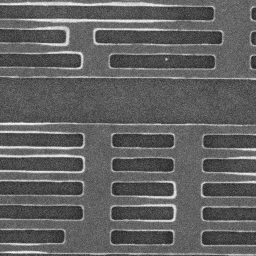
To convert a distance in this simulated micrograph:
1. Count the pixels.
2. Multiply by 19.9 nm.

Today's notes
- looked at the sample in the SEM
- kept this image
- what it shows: groups of lines, slits or small figures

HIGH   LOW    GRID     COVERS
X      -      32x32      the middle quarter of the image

----XXXXXXX---------------------
XXXXXXXXXXXXXXXXXXXXXXXXXXXXXXXX
XXXXXXXXXXXXXXXXXXXXXXXXXXXXXXXX
--------------------------------
--------------------------------
--------------------------------
--------------------------------
--------------------------------
--------------------------------
--------------------------------
--------------------------------
--------------------------------
--------------------------------
--------------------------------
--------------------------------
XXXXXXXXXXXXXXXXXXXXXXXXXXXXXXXX
XXXXXXXXXXXXXXXXXXXXXXXXXXXXXXXX
----XXXXXXXXX--------------XXXXX
-----XXXXXXX----------------XXXX
-----XXXXXXX----------------XXXX
-----XXXXXXX----------------XXXX
XXXXXXXXXXXXXXXXXXXXXXXXXXXXXXXX
XXXXXXXXXXXXXXXXXXXXXXXXXXXXXXXX
-----XXXXXXXX--------------XXXXX
-----XXXXXXX----------------XXXX
-----XXXXXXX----------------XXXX
-----XXXXXXX---------------XXXXX
XXXXXXXXXXXXXXXXXXXXXXXXXXXXXXXX
XXXXXXXXXXXXXXXXXXXXXXXXXXXXXXXX
----XXXXXXXXX--------------XXXXX
-----XXXXXXX----------------XXXX
-----XXXXXXX----------------XXXX